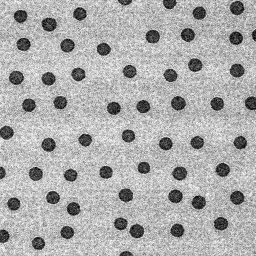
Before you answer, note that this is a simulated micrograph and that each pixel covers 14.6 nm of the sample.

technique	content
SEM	a regular array of holes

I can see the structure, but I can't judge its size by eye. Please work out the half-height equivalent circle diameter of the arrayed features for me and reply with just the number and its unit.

212 nanometers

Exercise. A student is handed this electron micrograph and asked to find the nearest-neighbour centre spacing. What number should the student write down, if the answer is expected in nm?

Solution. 438